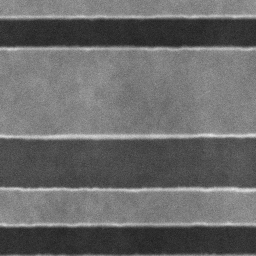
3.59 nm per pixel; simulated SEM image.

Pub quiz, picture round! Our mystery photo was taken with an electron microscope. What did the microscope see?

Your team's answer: lines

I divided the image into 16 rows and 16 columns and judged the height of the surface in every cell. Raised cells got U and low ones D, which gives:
UUUUUUUUUUUUUUUU
DDDDDDDDDDDDDDDD
DDDDDDDDDDDDDDDD
UUUUUUUUUUUUUUUU
UUUUUUUUUUUUUUUU
UUUUUUUUUUUUUUUU
UUUUUUUUUUUUUUUU
UUUUUUUUUUUUUUUU
UUUUUUUUDUDDDDDD
DDDDDDDDDDDDDDDD
DDDDDDDDDDDDDDDD
DDDDDDDDDDDDDDDD
UUUUUUUUUUUUUUUU
UUUUUUUUUUUUUUUU
DDDDDDDDDDDDDDDD
DDDDDDDDDDDDDDDD